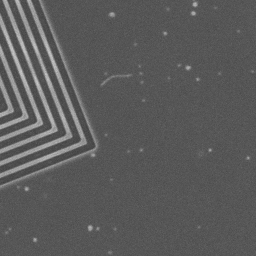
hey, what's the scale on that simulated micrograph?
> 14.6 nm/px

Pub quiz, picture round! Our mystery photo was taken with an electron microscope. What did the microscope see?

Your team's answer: groups of lines, slits or small figures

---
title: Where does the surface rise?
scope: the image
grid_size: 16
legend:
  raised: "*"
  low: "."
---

...*************
...*************
...*************
....************
....************
....************
.....***********
.....***********
......**********
.....***********
...*************
****************
****************
****************
****************
****************